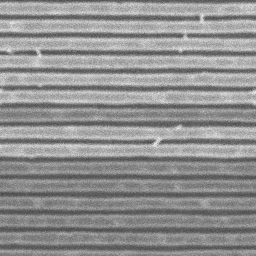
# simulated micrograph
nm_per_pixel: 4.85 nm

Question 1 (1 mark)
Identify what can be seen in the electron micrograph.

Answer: parallel lines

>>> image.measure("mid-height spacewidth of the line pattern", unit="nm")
32.7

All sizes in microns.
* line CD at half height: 0.0527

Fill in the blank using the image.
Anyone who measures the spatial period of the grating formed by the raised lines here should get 85.8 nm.